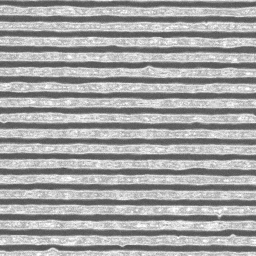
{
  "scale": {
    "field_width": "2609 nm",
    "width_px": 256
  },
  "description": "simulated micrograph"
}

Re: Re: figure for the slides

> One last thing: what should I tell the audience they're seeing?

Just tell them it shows parallel lines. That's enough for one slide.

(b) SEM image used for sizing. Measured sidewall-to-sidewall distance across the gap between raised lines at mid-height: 61.1 nanometers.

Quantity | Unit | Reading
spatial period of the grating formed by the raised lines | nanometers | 156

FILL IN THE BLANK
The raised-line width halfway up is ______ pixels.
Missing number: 9.5